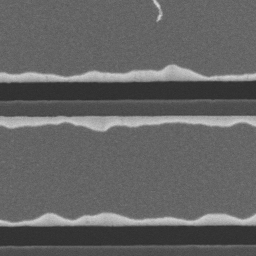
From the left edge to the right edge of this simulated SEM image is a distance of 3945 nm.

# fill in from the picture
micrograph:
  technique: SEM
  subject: lines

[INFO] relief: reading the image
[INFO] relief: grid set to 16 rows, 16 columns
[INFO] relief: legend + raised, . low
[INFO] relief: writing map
++++++++++++++++
++++++++++++++++
++++++++++++++++
++++++++++++++++
++++++++++++++++
................
................
++++++++++++++++
++++++++++++++++
++++++++++++++++
++++++++++++++++
++++++++++++++++
++++++++++++++++
++++++++++++++++
................
................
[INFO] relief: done